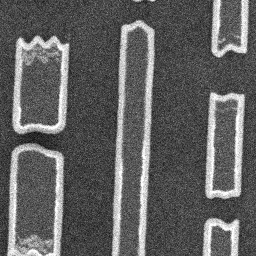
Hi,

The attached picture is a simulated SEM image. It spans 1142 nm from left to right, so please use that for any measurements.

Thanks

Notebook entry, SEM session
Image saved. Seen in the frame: one or a few lines or trenches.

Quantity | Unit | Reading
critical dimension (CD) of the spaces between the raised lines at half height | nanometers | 261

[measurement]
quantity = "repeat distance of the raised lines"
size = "419 nanometres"